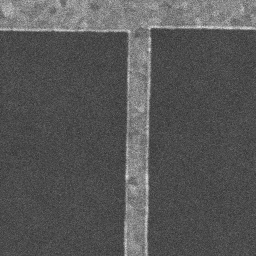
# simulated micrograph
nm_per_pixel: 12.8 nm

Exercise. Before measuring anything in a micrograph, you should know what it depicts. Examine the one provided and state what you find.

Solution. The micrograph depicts one or a few lines or trenches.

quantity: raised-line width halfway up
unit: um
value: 0.262